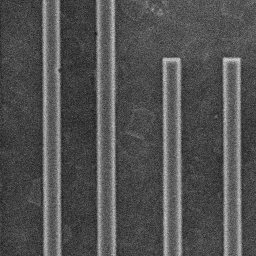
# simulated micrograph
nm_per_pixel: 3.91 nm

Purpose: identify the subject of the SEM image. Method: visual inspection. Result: parallel lines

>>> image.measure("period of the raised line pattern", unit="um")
0.23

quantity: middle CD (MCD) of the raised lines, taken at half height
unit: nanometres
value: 63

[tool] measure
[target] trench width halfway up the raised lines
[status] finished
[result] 171 nanometers